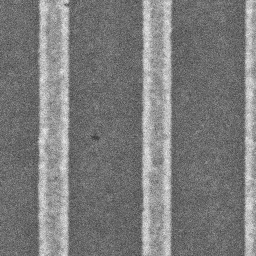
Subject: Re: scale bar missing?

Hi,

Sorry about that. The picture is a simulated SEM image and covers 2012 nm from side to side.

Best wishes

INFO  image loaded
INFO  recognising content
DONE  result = one or a few lines or trenches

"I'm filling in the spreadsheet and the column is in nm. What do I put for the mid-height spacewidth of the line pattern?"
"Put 637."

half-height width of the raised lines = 22 pixels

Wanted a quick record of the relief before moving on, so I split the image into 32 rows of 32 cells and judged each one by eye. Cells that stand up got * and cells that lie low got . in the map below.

.....***..........***..........*
.....***..........***..........*
.....***...........**..........*
.....***..........***..........*
.....***..........***..........*
......**..........***..........*
.....***..........***..........*
.....***..........***..........*
.....***..........***..........*
.....***..........***..........*
.....***..........***..........*
.....***..........***..........*
.....***..........***..........*
.....***..........***..........*
.....***..........***..........*
.....***..........***..........*
.....***..........***..........*
.....***..........***..........*
.....***..........***..........*
.....***..........***..........*
.....***..........***..........*
.....***..........***..........*
.....***..........***..........*
.....***..........***..........*
.....***..........***..........*
.....***..........***..........*
.....***..........***..........*
.....***..........***..........*
.....***..........***..........*
.....***..........***..........*
.....***..........***..........*
.....***..........***..........*